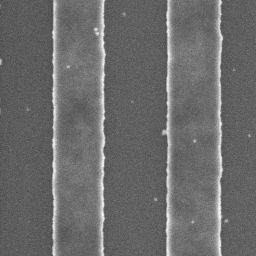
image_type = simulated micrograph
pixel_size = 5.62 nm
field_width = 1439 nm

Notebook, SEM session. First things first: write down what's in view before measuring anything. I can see lines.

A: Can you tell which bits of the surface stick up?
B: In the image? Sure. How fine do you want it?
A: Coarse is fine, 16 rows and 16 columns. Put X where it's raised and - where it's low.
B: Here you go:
---XXX----XXXX--
---XXX----XXXX--
---XXX-----XXX--
---XXXX----XXX--
---XXXX---XXXX--
---XXX----XXXX--
---XXXX---XXXX--
---XXX----XXXX--
---XXXX---XXXX--
---XXX-----XXX--
---XXX----XXXX--
---XXX----XXXX--
---XXX----XXXX--
---XXX----XXXX--
---XXX----XXXX--
---XXX----XXXX--